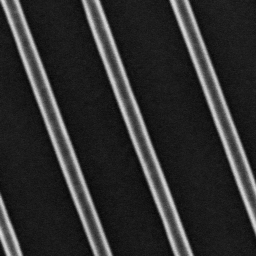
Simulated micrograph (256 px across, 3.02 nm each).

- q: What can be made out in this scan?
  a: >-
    one or a few lines or trenches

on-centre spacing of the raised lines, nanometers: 239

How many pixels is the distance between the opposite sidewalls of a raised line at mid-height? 14.2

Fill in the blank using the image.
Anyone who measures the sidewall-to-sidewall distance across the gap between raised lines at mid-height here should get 208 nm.